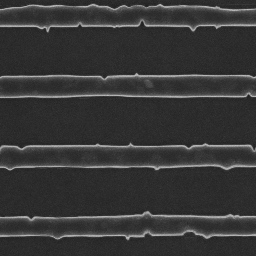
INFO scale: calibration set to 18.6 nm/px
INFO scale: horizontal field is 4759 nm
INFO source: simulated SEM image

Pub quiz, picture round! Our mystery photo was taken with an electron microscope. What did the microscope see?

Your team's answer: one or a few lines or trenches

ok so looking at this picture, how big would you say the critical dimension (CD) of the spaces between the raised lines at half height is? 922 nm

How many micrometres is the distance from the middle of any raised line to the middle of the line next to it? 1.3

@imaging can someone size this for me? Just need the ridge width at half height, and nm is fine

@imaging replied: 370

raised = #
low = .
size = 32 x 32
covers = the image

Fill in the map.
................................
################################
################################
.....#..................#.......
................................
................................
................................
................................
................................
................####.######.###.
################################
################################
................................
................................
................................
................................
................................
................................
##.#############################
################################
################################
................................
................................
................................
................................
................................
................................
################################
################################
......##.......###.......##.....
................................
................................